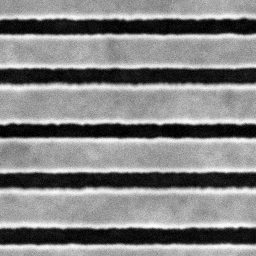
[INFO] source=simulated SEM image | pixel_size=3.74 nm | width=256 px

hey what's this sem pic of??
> lines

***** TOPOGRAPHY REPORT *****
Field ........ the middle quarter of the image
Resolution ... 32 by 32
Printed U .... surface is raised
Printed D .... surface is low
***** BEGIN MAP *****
UUUUUUUUUUUUUUUUUUUUUUUUUUUUUUUU
DDDDDDDDDDDDDDDDDDDDDDDDDDDDDDDD
DDDDDDDDDDDDDDDDDDDDDDDDDDDDDDDD
DDDDDDDDDDDDDDDDDDDDDDDDDDDDDDDD
DDDDDDDDDDDDDDDDDDDDDDDDDDDDDDDD
UUUUUUUUUUUUUUUUUUUUUUUUUUUUUUUU
UUUUUUUUUUUUUUUUUUUUUUUUUUUUUUUU
UUUUUUUUUUUUUUUUUUUUUUUUUUUUUUUU
UUUUUUUUUUUUUUUUUUUUUUUUUUUUUUUU
UUUUUUUUUUUUUUUUUUUUUUUUUUUUUUUU
UUUUUUUUUUUUUUUUUUUUUUUUUUUUUUUU
UUUUUUUUUUUUUUUUUUUUUUUUUUUUUUUU
UUUUUUUUUUUUUUUUUUUUUUUUUUUUUUUU
UUUUUUUUUUUUUUUUUUUUUUUUUUUUUUUU
UUUUUUUUUUUUUUUUUUUUUUUUUUUUUUUU
DDDDDDDDDDDDDDDDDDDDDDDDDDDDDDDD
DDDDDDDDDDDDDDDDDDDDDDDDDDDDDDDD
DDDDDDDDDDDDDDDDDDDDDDDDDDDDDDDD
DDDDDDDDDDDDDDDDDDDDDDDDDDDDDDDD
UUUUUUUUUUUUUUUUUUUUUUUUUUUUUUUU
UUUUUUUUUUUUUUUUUUUUUUUUUUUUUUUU
UUUUUUUUUUUUUUUUUUUUUUUUUUUUUUUU
UUUUUUUUUUUUUUUUUUUUUUUUUUUUUUUU
UUUUUUUUUUUUUUUUUUUUUUUUUUUUUUUU
UUUUUUUUUUUUUUUUUUUUUUUUUUUUUUUU
UUUUUUUUUUUUUUUUUUUUUUUUUUUUUUUU
UUUUUUUUUUUUUUUUUUUUUUUUUUUUUUUU
DDDDDDDDDDDDDDDDDDDDDDDDDDDDDDDD
DDDDDDDDDDDDDDDDDDDDDDDDDDDDDDDD
DDDDDDDDDDDDDDDDDDDDDDDDDDDDDDDD
DDDDDDDDDDDDDDDDDDDDDDDDDDDDDDDD
UUDDUUUUUUUUUUUUUUUUUUUUUUUUUUUU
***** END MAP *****